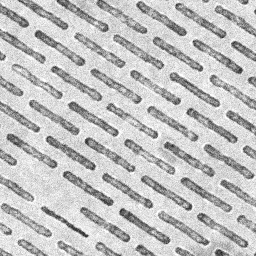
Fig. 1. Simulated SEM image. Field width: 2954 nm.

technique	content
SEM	a regular array of holes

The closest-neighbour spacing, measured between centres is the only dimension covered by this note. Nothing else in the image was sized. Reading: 449 nm